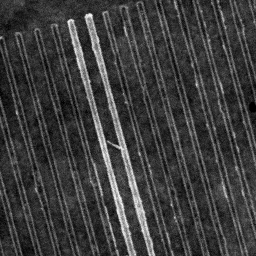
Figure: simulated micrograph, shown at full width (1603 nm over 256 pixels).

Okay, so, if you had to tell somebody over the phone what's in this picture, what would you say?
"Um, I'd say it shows parallel lines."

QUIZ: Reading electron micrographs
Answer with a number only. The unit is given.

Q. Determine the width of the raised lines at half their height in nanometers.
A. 31.7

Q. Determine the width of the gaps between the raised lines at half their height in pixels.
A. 12.9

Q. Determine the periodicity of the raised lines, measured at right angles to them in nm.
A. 113